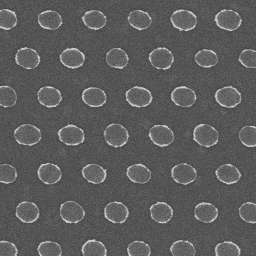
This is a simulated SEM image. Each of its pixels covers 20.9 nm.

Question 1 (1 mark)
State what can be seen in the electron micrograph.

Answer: a regular array of raised bodies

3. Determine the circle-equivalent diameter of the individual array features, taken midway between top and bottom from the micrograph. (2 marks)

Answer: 0.468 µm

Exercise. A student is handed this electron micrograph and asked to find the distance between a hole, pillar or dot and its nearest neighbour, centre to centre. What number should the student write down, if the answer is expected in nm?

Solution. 926